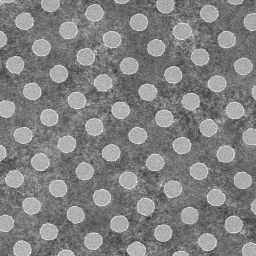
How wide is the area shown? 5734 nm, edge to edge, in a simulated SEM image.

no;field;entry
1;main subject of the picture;a regular array of raised bodies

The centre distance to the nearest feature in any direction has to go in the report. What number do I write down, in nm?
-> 701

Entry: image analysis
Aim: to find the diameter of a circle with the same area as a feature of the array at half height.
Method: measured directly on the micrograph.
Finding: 383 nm